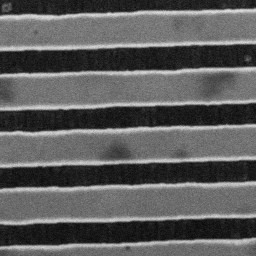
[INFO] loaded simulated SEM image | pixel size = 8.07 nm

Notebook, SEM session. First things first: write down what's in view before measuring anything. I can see lines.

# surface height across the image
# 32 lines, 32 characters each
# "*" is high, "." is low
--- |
................................
.................***************
********************************
********************************
********************************
****************************....
................................
................................
...............................*
********************************
********************************
********************************
********************************
***********.....................
................................
................................
.....*.*************************
********************************
********************************
********************************
********........................
................................
................................
..*..***************************
********************************
********************************
********************************
********************............
................................
................................
...............*****************
********************************